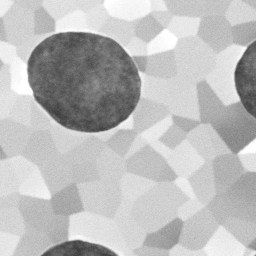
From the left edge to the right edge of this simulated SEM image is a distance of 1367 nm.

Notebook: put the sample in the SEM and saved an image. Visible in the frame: holes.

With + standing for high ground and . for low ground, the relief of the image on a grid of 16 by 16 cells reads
++++++++++++++++
++++++++++++++++
+++....+++++++++
++......+++++++.
++.......++++++.
++.......++++++.
++.......++++++.
+++.....++++++++
++++++++++++++++
++++++++++++++++
++++++++++++++++
++++++++++++++++
++++++++++++++++
++++++++++++++++
++++++++++++++++
+++....+++++++++